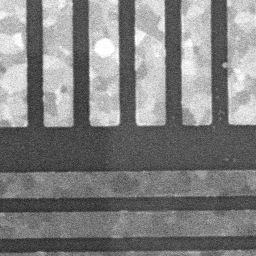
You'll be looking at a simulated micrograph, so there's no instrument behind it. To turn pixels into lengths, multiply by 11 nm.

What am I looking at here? groups of lines, slits or small figures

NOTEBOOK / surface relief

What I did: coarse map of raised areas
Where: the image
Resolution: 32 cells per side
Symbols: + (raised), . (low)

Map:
+++..++++..++++..+++...+++...+++
+++..++++..++++..+++...+++...+++
+++..++++..++++..+++...+++...+++
+++..++++..++++..+++...+++...+++
+++...+++..++++..+++...+++...+++
+++...+++..++++..++++..+++...+++
+++...+++..++++..++++..+++...+++
+++...+++..++++..++++..+++..++++
+++...+++..++++..++++..+++..++++
+++...+++..++++..++++..+++...+++
+++...+++..++++..++++..+++...+++
+++...+++..++++..++++..+++...+++
+++...+++..++++..++++..+++...+++
+++...+++..++++..++++..+++...+++
+++...+++..++++..++++..+++...+++
+++...+++..+++....++...+++......
................................
................................
................................
................................
................................
............++++.+++++++++++++++
++++++++++++++++++++++++++++++++
++++++++++++++++++++++++++++++++
++++++++++++++++++++............
................................
......................++...+++++
++++++++++++++++++++++++++++++++
++++++++++++++++++++++++++++++++
+++++++++++++++++...............
................................
..........................++++++